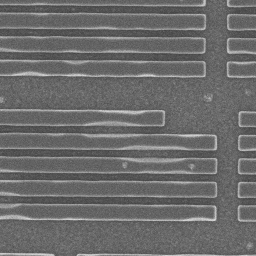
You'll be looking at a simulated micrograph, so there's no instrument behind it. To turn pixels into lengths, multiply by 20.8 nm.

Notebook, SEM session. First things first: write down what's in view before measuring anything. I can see groups of lines, slits or small figures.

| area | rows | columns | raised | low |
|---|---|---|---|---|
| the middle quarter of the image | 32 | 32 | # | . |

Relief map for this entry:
################################
################################
################################
................................
................................
................................
................................
................................
................................
................................
................................
................................
#########################.......
#########################.......
#########################.......
................................
................................
####............................
################################
################################
################################
................................
................................
############....................
################################
################################
################################
................................
................................
####################..##........
################################
################################